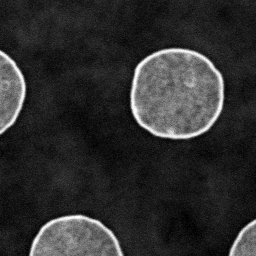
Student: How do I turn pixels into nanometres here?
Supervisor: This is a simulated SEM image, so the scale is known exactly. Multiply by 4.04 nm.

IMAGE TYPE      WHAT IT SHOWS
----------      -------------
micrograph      raised bodies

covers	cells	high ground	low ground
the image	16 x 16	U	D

DDDDDDDDDDDDDDDD
DDDDDDDDDDDDDDDD
DDDDDDDDDDDDDDDD
DDDDDDDDDDUUDDDD
UDDDDDDDDUUUUUDD
UDDDDDDDUUUUUUDD
UDDDDDDDUUUUUUDD
UDDDDDDDDUUUUDDD
DDDDDDDDDDDUDDDD
DDDDDDDDDDDDDDDD
DDDDDDDDDDDDDDDD
DDDDDDDDDDDDDDDD
DDDDDDDDDDDDDDDD
DDDDDDDDDDDDDDDD
DDDUUUUDDDDDDDDU
DDUUUUUDDDDDDDDU